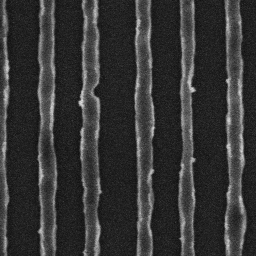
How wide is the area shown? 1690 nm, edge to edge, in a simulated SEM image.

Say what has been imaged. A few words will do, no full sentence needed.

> parallel lines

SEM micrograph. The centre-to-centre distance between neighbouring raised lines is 0.309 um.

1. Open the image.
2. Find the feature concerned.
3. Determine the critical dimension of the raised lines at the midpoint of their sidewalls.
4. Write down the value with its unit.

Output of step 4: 91.6 nm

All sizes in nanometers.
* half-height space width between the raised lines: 216